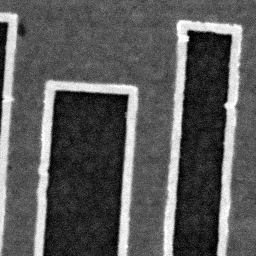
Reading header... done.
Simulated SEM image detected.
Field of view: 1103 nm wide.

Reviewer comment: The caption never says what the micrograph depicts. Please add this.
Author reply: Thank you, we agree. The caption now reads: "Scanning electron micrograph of one or a few lines or trenches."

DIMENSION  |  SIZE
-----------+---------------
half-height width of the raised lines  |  197 nm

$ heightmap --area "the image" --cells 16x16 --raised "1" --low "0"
1111111111111111
0111111111111111
0111111111100001
0111111111100001
0111111111100001
1110001111100001
1110000011100011
1110000011100011
1110000011100011
1110000011100011
1110000011100011
1110000011100011
1110000011100011
1110000011100011
1100000011100011
1100000011100011